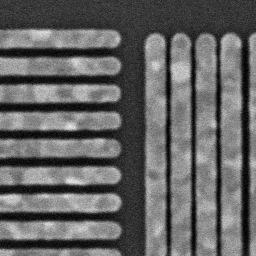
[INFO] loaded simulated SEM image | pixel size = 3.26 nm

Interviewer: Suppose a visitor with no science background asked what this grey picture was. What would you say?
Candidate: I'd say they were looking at groups of lines, slits or small figures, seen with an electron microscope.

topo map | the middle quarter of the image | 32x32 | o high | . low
oooooooooooooo.......oooo..ooooo
oooooooooooooo.......oooo..oooo.
ooooooooooooo........oooo..oooo.
.....................oooo..oooo.
.....................oooo..ooooo
ooooooooooooo........oooo..ooooo
oooooooooooooo.......oooo..ooooo
oooooooooooooo.......oooo..ooooo
oooooooooooooo.......oooo..ooooo
.....................oooo..ooooo
.....................oooo..ooooo
....................ooooo..ooooo
ooooooooooooo........ooooo.ooooo
oooooooooooooo.......ooooo.ooooo
oooooooooooooo.......oooo..ooooo
oooooooooooooo.......oooo..ooooo
.....................oooo..ooooo
.....................oooo..ooooo
.....................oooo..ooooo
ooooooooooooo........oooo..ooooo
oooooooooooooo.......oooo..ooooo
oooooooooooooo.......oooo..ooooo
oooooooooooooo.......oooo..ooooo
.....................oooo..ooooo
.....................oooo..ooooo
.....................oooo..ooooo
ooooooooooooo.......ooooo..ooooo
oooooooooooooo......ooooo..ooooo
oooooooooooooo......ooooo..ooooo
ooooooooooooo........oooo..ooooo
.....................ooooo.ooooo
.....................ooooo.ooooo